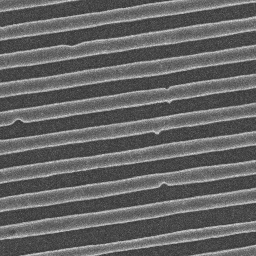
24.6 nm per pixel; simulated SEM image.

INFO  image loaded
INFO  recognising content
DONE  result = parallel lines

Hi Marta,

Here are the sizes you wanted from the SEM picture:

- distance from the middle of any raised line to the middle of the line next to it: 700 nm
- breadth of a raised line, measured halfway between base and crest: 0.32 um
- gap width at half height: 366 nanometres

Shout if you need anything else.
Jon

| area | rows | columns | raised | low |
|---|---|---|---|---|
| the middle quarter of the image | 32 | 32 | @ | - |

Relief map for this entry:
--------------@@@@@@@@@@@@@@@@@@
------@@@@@@@@@@@@@@@@@@@@@@@@--
-@@@@@@@@@@@@@@@@@@@@@@@@-------
@@@@@@@@@@@@@@@@@---------------
@@@@@@@@@-----------------------
@@@-------------------------@@@@
-----------------------@@@@@@@@@
---------------@@@@@@@@@@@@@@@@@
--------@@@@@@@@@@@@@@@@@@@@@@--
--@@@@@@@@@@@@@@@@@@@@@@--------
@@@@@@@@@@@@@@@@@---------------
@@@@@@@@@@----------------------
@@@@--------------------------@@
------------------------@@@@@@@@
------------------@@@@@@@@@@@@@@
----------@@@@@@@@@@@@@@@@@@@@@-
---@@@@@@@@@@@@@@@@@@@@@@-------
@@@@@@@@@@@@@@@@@@@-------------
@@@@@@@@@@@@--------------------
@@@@--------------------------@@
-----------------------@@@@@@@@@
------------------@@@@@@@@@@@@@@
-----------@@@@@@@@@@@@@@@@@@@@@
-----@@@@@@@@@@@@@@@@@@@@@------
@@@@@@@@@@@@@@@@@@@-------------
@@@@@@@@@@@---------------------
@@@@--------------------------@@
-------------------------@@@@@@@
-----------------@@@@@@@@@@@@@@@
------------@@@@@@@@@@@@@@@@@@@@
-----@@@@@@@@@@@@@@@@@@@--------
@@@@@@@@@@@@@@@@@@@-------------